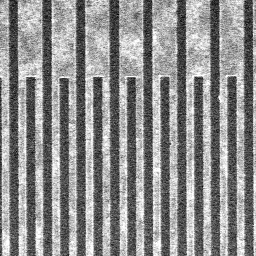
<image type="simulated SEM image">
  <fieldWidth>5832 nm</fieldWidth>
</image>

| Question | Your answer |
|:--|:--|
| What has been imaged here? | parallel lines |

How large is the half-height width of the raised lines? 151 nm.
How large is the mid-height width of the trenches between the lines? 236 nm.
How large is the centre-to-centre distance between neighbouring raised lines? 0.382 µm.